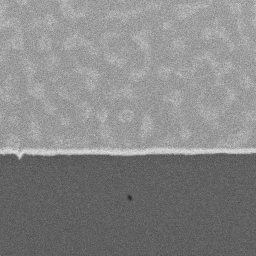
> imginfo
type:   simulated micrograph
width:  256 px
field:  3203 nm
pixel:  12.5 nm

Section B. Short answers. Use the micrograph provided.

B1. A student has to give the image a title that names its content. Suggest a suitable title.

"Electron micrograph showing one or a few lines or trenches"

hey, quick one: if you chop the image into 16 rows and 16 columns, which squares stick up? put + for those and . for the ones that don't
++++++++++++++++
++++++++++++++++
++++++++++++++++
++++++++++++++++
++++++++++++++++
++++++++++++++++
++++++++++++++++
++++++++++++++++
++++++++++++++++
..+...+++.......
................
................
................
................
................
................